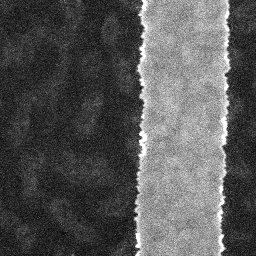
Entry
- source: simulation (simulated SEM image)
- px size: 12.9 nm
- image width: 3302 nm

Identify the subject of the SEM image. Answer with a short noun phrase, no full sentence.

one or a few lines or trenches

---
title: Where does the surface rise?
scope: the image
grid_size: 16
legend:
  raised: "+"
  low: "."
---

.........+++++..
.........+++++..
.........+++++..
.........+++++..
.........+++++..
.........+++++..
.........+++++..
.........+++++..
.........+++++..
.........+++++..
.........+++++..
.........+++++..
.........+++++..
.........+++++..
.........+++++..
.........+++++..